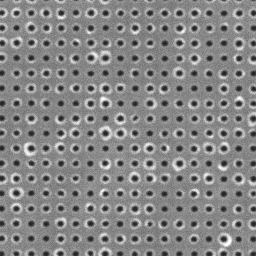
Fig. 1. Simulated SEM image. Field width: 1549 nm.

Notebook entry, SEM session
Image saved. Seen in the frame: a regular array of holes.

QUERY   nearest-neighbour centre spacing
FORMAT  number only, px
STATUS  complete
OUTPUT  14.6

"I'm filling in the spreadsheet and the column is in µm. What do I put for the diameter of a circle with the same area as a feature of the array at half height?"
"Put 0.0374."